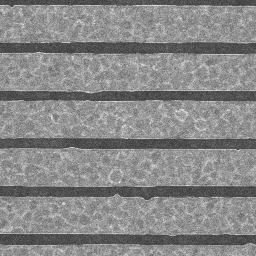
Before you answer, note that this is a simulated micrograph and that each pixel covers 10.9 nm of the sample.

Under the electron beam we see parallel lines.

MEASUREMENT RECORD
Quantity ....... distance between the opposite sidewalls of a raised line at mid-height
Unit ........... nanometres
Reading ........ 404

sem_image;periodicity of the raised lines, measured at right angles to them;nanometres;522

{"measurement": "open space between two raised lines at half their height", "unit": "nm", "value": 124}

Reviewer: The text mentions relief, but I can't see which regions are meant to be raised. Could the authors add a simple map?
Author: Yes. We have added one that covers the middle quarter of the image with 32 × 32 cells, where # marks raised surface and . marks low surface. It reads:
################################
################################
################################
################################
################################
################################
################################
................................
................................
################################
################################
################################
################################
################################
################################
################################
################################
################################
....................############
................................
................................
################################
################################
################################
################################
################################
################################
################################
################################
################################
..###...........................
................................